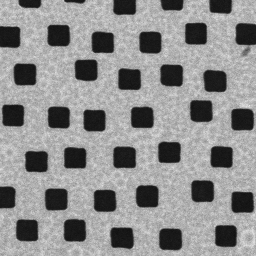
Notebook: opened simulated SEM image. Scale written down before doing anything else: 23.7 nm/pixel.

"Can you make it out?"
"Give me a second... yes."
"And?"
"a regular array of holes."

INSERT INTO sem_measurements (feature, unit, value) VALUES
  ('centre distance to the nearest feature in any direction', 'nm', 924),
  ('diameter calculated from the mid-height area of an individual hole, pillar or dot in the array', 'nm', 576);